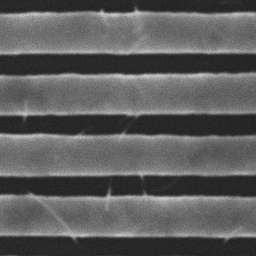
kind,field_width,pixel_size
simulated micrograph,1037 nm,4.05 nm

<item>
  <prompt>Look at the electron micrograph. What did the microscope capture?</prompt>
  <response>lines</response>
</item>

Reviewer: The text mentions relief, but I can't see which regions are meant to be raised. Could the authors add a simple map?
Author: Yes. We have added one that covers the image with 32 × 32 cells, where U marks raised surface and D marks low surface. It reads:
DDDDDDDDDDDDDDDDDDDDDDDDDDDDDDDD
DDDDDDDDDUUUUDDDDUUDDDDDDDDDDDDD
UUUUUUUUUUUUUUUUUUUUUUUUUUUUUUUU
UUUUUUUUUUUUUUUUUUUUUUUUUUUUUUUU
UUUUUUUUUUUUUUUUUUUUUUUUUUUUUUUU
UUUUUUUUUUUUUUUUUUUUUUUUUUUUUUUU
UUUUUUUUUUUUUUUUUUUUUUUUUUUUUUUU
DDDDDDDDDDDDDDDDDDDDDDDDDDDDDDDD
DDDDDDDDDDDDDDDDDDDDDDDDDDDDDDDD
UDDUUUUUUUUUUUUUUUUUUUUUUUUUUUUU
UUUUUUUUUUUUUUUUUUUUUUUUUUUUUUUU
UUUUUUUUUUUUUUUUUUUUUUUUUUUUUUUU
UUUUUUUUUUUUUUUUUUUUUUUUUUUUUUUU
UUUUUUUUUUUUUUUUUUUUUUUUUUUUUUUU
DDDDDDDDDDDDDDDDDDDDDDDDDDDDDDDD
DDDDDDDDDDDDDDDDDDDDDDDDDDDDDDDD
DDDDDDDDDDDDDDDDDDDDDDDDDDDDDDDD
UUUUUUUUUUUUUUUUUUUUUUUUUUUUUUUU
UUUUUUUUUUUUUUUUUUUUUUUUUUUUUUUU
UUUUUUUUUUUUUUUUUUUUUUUUUUUUUUUU
UUUUUUUUUUUUUUUUUUUUUUUUUUUUUUUU
UUUUUUUUUUUUUUUUUUUUUUUUUUUUUUUU
DDDDDDDDDDDDDDDDDDDDDDDDDDDDDDDD
DDDDDDDDDDDDDDDDDDDDDDDDDDDDDDDD
UUUUUUDDDDDDDUUUUUUUDDUUUUDDDDDD
UUUUUUUUUUUUUUUUUUUUUUUUUUUUUUUU
UUUUUUUUUUUUUUUUUUUUUUUUUUUUUUUU
UUUUUUUUUUUUUUUUUUUUUUUUUUUUUUUU
UUUUUUUUUUUUUUUUUUUUUUUUUUUUUUUU
DDDDDDDDUUUUUUUUUUUUUUUUUUUUUUUU
DDDDDDDDDDDDDDDDDDDDDDDDDDDDDDDD
DDDDDDDDDDDDDDDDDDDDDDDDDDDDDDDD